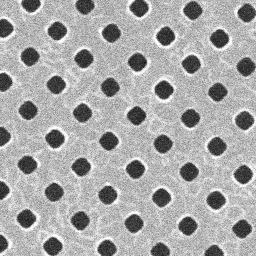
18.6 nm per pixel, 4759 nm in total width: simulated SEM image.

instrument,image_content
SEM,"a regular array of holes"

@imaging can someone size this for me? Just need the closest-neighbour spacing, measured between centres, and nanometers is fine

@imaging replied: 699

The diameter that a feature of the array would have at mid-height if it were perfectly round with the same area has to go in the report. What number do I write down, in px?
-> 19.2